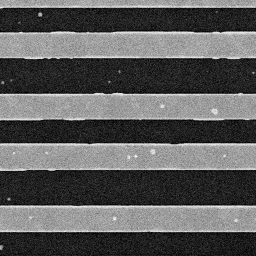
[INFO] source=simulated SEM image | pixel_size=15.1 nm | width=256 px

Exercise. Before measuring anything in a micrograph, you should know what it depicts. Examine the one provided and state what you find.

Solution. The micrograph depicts lines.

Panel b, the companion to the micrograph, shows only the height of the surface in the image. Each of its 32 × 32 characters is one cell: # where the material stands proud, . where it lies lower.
################################
................................
................................
................................
################################
################################
################################
................................
................................
................................
................................
................................
################################
################################
################################
................................
................................
................................
################################
################################
################################
................................
................................
................................
................................
................................
################################
################################
################################
................................
................................
................................